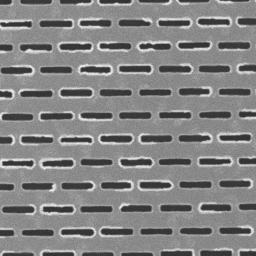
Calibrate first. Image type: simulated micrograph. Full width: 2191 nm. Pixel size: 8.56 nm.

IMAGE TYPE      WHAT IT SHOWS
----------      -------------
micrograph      a regular array of holes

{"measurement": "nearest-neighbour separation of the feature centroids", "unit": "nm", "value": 254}